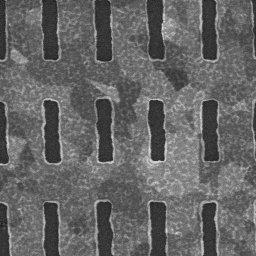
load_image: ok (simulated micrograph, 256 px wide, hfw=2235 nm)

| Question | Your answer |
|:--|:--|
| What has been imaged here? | holes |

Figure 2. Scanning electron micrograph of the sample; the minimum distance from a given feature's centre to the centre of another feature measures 458 nm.